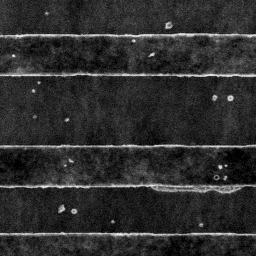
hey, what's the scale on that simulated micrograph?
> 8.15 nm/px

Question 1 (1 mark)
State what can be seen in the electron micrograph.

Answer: lines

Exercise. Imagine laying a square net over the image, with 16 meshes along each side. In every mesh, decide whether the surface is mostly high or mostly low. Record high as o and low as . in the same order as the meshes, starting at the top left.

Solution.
................
................
oooooooooooooooo
oooooooooooooooo
oooooooooooooooo
................
................
................
................
oooooooooooooooo
oooooooooooooooo
oooooooooooooooo
................
................
................
oooooooooooooooo